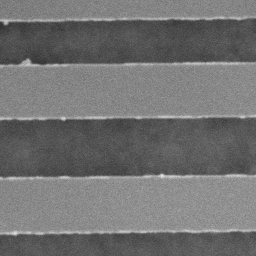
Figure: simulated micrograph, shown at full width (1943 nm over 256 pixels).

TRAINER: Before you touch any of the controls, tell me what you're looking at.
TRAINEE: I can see lines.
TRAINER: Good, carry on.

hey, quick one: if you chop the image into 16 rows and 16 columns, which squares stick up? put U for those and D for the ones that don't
UUUUUUUUUUUUUUUU
DDDDDDDDDDDDDDDD
DDDDDDDDDDDDDDDD
DDDDDDDDDDDDDDDD
UUUUUUUUUUUUUUUU
UUUUUUUUUUUUUUUU
UUUUUUUUUUUUUUUU
DDDDDDDDDDDDDDDD
DDDDDDDDDDDDDDDD
DDDDDDDDDDDDDDDD
DDDDDDDDDDDDDDDD
UUUUUUUUUUUUUUUU
UUUUUUUUUUUUUUUU
UUUUUUUUUUUUUUUU
UUUUUUUUUUUDUDDD
DDDDDDDDDDDDDDDD